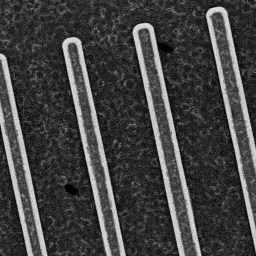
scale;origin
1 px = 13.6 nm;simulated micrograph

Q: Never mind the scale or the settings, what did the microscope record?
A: one or a few lines or trenches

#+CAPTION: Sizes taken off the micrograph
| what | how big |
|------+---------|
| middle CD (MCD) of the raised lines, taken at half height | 226 nanometers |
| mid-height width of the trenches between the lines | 778 nm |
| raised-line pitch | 1.02 microns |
